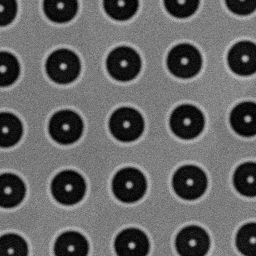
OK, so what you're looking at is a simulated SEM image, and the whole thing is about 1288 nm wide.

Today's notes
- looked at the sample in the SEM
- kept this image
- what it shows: an array of small figures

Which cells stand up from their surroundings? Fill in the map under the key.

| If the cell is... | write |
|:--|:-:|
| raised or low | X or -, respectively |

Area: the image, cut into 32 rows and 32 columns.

--XXX-----XXX----XXX-----XXX----
--XXX-----XXX----XXXX----XXXX---
--XXXX---XXXXX--XXXXXXXXXXXXXXXX
XXXXXXXXXXXXXXXXXXXXXXXXXXXXXXXX
XXXXXXXXXXXXXXXXXXXXXXXXXXXXXXXX
XXXXXXXXXXXXXXXXXXXXXX--XXXXX---
-XXXXX---XXXXX---XXXX----XXX----
--XXXX----XXX-----XXX----XXX----
X--XXX----XXX-----XXX----XXXX---
---XXX----XXXX---XXXXX---XXXXX-X
--XXXXX--XXXXXXXXXXXXXXXXXXXXXXX
XXXXXXXXXXXXXXXXXXXXXXXXXXXXXXXX
XXXXXXXXXXXXXXXXXXXXXXXXXXXXXXXX
XXXXXXXXXXXXXXX--XXXXX---XXXX---
--XXXX----XXXX----XXX-----XXX---
---XXX-----XX-----XXX-----XXX---
---XXX----XXXX----XXX----XXXX---
---XXX----XXXXX--XXXXXX-XXXXXXXX
-XXXXXXXXXXXXXXXXXXXXXXXXXXXXXXX
XXXXXXXXXXXXXXXXXXXXXXXXXXXXXXXX
XXXXXXXXXXXXXXXXXXXXXXX-XXXXXX--
X-XXXXX---XXXX----XXXX----XXX---
---XXX-----XXX----XXX-----XXX---
---XXX--X--XXX-----XX-----XXX---
---XXX-----XXX----XXXX---XXXXX--
---XXXX---XXXXXXXXXXXXXXXXXXXXXX
XXXXXXXXXXXXXXXXXXXXXXXXXXXXXXXX
XXXXXXXXXXXXXXXXXXXXXXXXXXXXXXXX
XXXXXXXXXXXXXXXX-XXXXXX--XXXXX--
---XXXX----XXX-----XXX----XXX---
----XXX----XXX-----XXX----XXX---
----XXX----XXX-----XXX----XXXX--